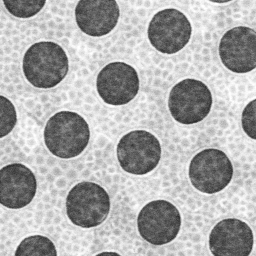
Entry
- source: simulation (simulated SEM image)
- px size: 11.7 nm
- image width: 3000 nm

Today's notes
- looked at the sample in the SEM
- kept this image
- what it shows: a regular array of holes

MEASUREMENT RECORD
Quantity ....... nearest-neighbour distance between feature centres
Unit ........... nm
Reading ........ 851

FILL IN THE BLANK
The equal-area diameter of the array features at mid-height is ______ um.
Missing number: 0.537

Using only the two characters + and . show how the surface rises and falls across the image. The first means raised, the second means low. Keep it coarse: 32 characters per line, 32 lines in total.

......++++.....+++++++++++++++++
+....++++......+++++...+++++++++
+++++++++......++++.....++++++++
++++++++++....++++......+++++..+
+++++++++++..+++++......++++....
++++...++++++++++++....++++.....
+++.....++++++++++++..+++++.....
+++......+++++++++++++++++++....
+++......++++....+++++++++++....
+++.....++++.....+++++++++++++++
++++...+++++.....+++++....++++++
++++++++++++.....++++.....++++++
.++++++++++++....++++......+++++
..+++++++++++++++++++.....++++..
..+++++...+++++++++++.....++++..
..++++.....++++++++++++.++++++..
.++++......+++++...+++++++++++..
+++++......++++.....++++++++++++
++++++.....++++.....++++++++++++
+++++++...+++++.....++++....++++
+..++++++++++++.....++++.....+++
....++++++++++++...++++......+++
....++++++++++++++++++++.....+++
.....++++....+++++++++++....++++
....++++......++++++++++++++++++
....++++......++++....++++++++++
++++++++......+++.....++++++++++
+++++++++....++++......+++++..++
+++++++++++++++++......++++....+
+++..+++++++++++++....++++......
++.....++++++++++++..+++++......
++.....++++++.++++++++++++.....+